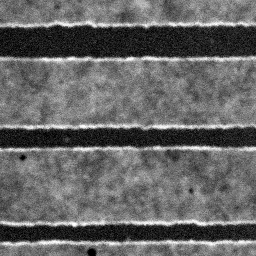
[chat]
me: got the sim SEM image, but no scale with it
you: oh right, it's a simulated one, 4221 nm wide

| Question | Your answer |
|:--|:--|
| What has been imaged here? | one or a few lines or trenches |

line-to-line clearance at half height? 1.17 um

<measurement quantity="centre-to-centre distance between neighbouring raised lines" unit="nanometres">1580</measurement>